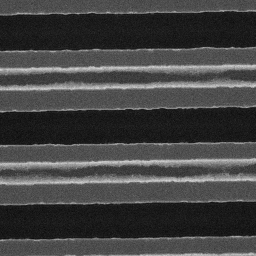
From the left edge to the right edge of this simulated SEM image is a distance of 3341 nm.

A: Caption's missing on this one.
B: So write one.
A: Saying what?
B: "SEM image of lines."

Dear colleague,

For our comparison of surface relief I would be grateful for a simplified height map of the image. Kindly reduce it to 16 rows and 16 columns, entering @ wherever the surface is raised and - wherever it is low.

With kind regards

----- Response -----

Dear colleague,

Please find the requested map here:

@@@@@@@@@@@@@@@@
----------------
----------------
@@@@@@@@@@@@@@@@
@@@@@@@@@@@@@@@@
@@@@@@@@@@@@@@@@
@@@@@@@@@@@@@@@@
----------------
----------------
@@@@@@@@@@@@@@@@
@@@@@@@@@@@@@@@@
@@@@@@@@@@@@@@@@
@@@@@@@@@@@@@@@@
----------------
----------------
@@@@@@@@@@@@@@@@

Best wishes